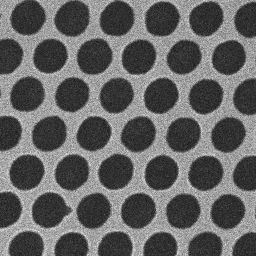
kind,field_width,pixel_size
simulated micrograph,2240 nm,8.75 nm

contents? a regular array of holes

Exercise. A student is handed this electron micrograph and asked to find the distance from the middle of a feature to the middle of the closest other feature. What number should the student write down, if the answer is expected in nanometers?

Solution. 386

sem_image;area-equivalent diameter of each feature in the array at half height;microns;0.307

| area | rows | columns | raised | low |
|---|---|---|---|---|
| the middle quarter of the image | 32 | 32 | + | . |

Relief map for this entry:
+++........++++.......++++......
++++......+++++......++++++.....
++++++..++++++++....++++++++...+
+...++++++++..+++++++++...++++++
.....++++++.....++++++.....+++++
......++++.......++++.......++++
......+++........+++........++++
......+++........+++.........++.
......+++........+++.........++.
......+++........+++........+++.
.....++++.......++++........++++
....++++++.....++++++.....++++++
+++++++++++++++++++++++.++++++++
++++++....+++++++....+++++++++..
+++++......+++++......+++++.....
++++........+++........+++......
.++.........+++........+++......
.++.........++.........+++......
+++.........++.........++.......
+++........+++........++++......
++++......+++++......+++++......
++++++...+++++++....+++++++.....
+++++++++++++.++++++++++++++++++
.....++++++.....++++++.....+++++
......+++........++++.......++++
......+++........++++........+++
......+++.........++.........++.
......+++........+++.........++.
......+++........+++........+++.
......+++........++++.......+++.
.....+++++......+++++......+++++
...+++++++++.++++++++++..+++++++